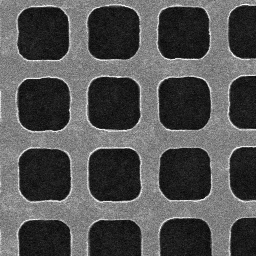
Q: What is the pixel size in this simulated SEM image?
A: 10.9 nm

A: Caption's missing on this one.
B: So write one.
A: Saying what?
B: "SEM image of a regular array of holes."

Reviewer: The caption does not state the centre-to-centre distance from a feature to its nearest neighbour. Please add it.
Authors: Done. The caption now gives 767 nanometers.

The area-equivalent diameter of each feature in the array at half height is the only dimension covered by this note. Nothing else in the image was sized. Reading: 616 nanometers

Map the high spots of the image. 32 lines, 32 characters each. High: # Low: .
################################
###.....###......###......###...
##......###......###......###...
##.......##......###......##....
##.......##......###......##....
##.......##......###......###...
##......###......###......###...
####.#.######.##################
################################
###############################.
###.....###......###......###...
##.......##......###......###...
##.......##......###......###...
##.......##......###......###...
##.......##......###......###...
###.....####.....###......###...
################################
################################
####.##########.##############..
###......##......###......###...
##.......##.......##......###...
##.......##.......##......###...
##.......##.......##......###...
##.......##.......##......###...
###.....####.....####.....###...
################################
################################
####...######...#####....#####..
###......##......###......###...
##.......##.......##.......##...
##.......##.......##......###...
##.......##.......##.......##...